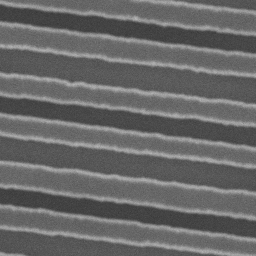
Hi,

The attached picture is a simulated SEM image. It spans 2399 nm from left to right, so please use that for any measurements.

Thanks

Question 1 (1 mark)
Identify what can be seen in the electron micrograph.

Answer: lines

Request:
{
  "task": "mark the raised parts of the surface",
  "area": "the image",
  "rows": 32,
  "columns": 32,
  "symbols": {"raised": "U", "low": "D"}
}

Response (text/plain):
UUUUUUUUUUUUUUUUUUUUUUUUDDDDDDDD
DDDDDDDUUUUUUUUUUUUUUUUUUUUUUUUU
DDDDDDDDDDDDDDDDUUUUUUUUUUUUUUUU
UUUUUUDDDDDDDDDDDDDDDDDUUUUUUUUU
UUUUUUUUUUUUUUDDDDDDDDDDDDDDDDDD
UUUUUUUUUUUUUUUUUUUUUUDDDDDDDDDD
DDDDDUUUUUUUUUUUUUUUUUUUUUUUUUDD
DDDDDDDDDDDDDUUUUUUUUUUUUUUUUUUU
DDDDDDDDDDDDDDDDDDDDDDUUUUUUUUUU
UUUUDDDDDDDDDDDDDDDDDDDDDDDDDDDU
UUUUUUUUUUUDDDDDDDDDDDDDDDDDDDDD
UUUUUUUUUUUUUUUUUUUUDDDDDDDDDDDD
DDDDUUUUUUUUUUUUUUUUUUUUUUUUDDDD
DDDDDDDDDDDDDUUUUUUUUUUUUUUUUUUU
UUUDDDDDDDDDDDDDDDDDUUUUUUUUUUUU
UUUUUUUUUUUDDDDDDDDDDDDDDDDDUUUU
UUUUUUUUUUUUUUUUUUDDDDDDDDDDDDDD
DDDDDUUUUUUUUUUUUUUUUUUUUDDDDDDD
DDDDDDDDDDDDUUUUUUUUUUUUUUUUUUUU
DDDDDDDDDDDDDDDDDDDUUUUUUUUUUUUU
UUUUDDDDDDDDDDDDDDDDDDDDDDDDUUUU
UUUUUUUUUUUDDDDDDDDDDDDDDDDDDDDD
UUUUUUUUUUUUUUUUUUUDDDDDDDDDDDDD
UUUUUUUUUUUUUUUUUUUUUUUUUUUDDDDD
DDDDDDDDUUUUUUUUUUUUUUUUUUUUUUUU
DDDDDDDDDDDDDDDDUUUUUUUUUUUUUUUU
UUUUUUUDDDDDDDDDDDDDDDDUUUUUUUUU
UUUUUUUUUUUUUUUDDDDDDDDDDDDDDDDU
UUUUUUUUUUUUUUUUUUUUUUUDDDDDDDDD
DDDDDDDDUUUUUUUUUUUUUUUUUUUUUUDD
DDDDDDDDDDDDDDDDUUUUUUUUUUUUUUUU
DDDDDDDDDDDDDDDDDDDDDDDDUUUUUUUU